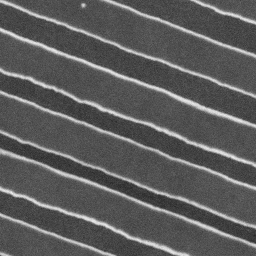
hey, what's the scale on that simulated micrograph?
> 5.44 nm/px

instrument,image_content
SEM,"lines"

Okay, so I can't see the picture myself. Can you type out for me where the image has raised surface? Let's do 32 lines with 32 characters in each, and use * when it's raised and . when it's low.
.**************..........*******
...**************..........*****
......**************..........**
.........**************.........
**..........**************......
*****.........**************....
********........***************.
**********.........*************
*************.........**********
..*************..........*******
.....*************.........*****
.......**************.........**
***......**************.........
*****.......**************......
********.......**************...
***********.......*************.
*************.......************
..**************.......*********
.....**************......*******
***.....*************.......****
*****.....**************.......*
********.....**************.....
***********.....*************...
*************.....**************
..**************.....***********
.....*************......********
........*************.....******
**.........*************.....***
*****.........*************.....
*******.........*************...
**********........**************
*************........***********